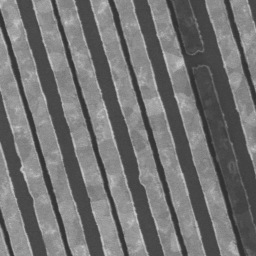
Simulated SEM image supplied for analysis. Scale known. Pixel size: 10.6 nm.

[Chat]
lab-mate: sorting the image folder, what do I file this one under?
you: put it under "parallel lines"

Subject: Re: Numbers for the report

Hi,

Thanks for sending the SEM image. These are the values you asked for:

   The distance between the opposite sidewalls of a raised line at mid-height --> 17.2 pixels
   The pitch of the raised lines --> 292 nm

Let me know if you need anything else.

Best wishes